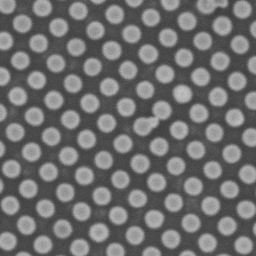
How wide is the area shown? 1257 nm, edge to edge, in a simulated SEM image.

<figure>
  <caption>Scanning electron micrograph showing a regular array of raised bodies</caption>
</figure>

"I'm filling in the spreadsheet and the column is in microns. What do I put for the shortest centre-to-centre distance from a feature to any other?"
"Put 0.123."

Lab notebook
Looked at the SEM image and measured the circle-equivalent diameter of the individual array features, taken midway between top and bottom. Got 85 nm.